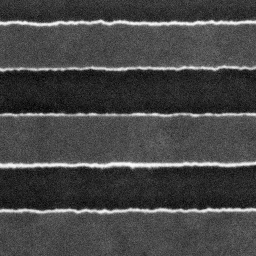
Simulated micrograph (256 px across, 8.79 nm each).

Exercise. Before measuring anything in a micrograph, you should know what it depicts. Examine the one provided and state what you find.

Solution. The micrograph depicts lines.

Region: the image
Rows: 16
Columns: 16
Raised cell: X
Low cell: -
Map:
----------------
XXXXXXXXXXXXXXXX
XXXXXXXXXXXXXXXX
XXXXXXXXXXXXXXXX
----------------
----------------
----------------
XXXXXXXXXXXXXXXX
XXXXXXXXXXXXXXXX
XXXXXXXXXXXXXXXX
----------------
----------------
----------------
XXXXXXXXXXXXXXXX
XXXXXXXXXXXXXXXX
XXXXXXXXXXXXXXXX